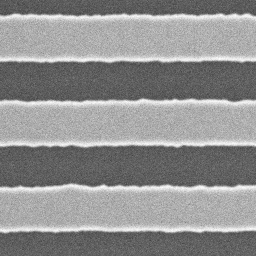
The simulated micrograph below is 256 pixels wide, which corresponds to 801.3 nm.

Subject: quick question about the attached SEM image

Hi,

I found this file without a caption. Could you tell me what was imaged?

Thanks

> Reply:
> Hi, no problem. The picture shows lines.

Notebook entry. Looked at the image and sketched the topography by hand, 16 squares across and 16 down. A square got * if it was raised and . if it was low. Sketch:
................
****************
****************
****************
................
................
****************
****************
****************
................
................
................
****************
****************
................
................